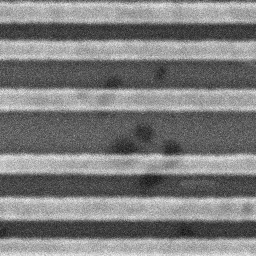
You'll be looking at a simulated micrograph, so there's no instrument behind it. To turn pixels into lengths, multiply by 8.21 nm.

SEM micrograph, lines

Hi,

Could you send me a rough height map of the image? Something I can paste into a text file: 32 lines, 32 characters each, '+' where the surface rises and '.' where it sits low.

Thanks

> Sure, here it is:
+.+++++++++++.+..+.+++.++++++++.
++++++++++++++++++++++++++++++++
++++++++++++++++++++++++++++++++
................................
................................
++++++++++++++++++++++++++++++++
++++++++++++++++++++++++++++++++
................................
................................
................................
................................
++++++++++++++++++++++++++++++++
++++++++++++++++++++++++++++++++
++++++++++++++++++++++++++++++++
................................
................................
................................
................................
................................
+++++...+.+++.+.++++...+.....+++
++++++++++++++++++++++++++++++++
++++++++++++++++++++++++++++++++
................................
................................
................................
++++++++++++++++++++++++++++++++
++++++++++++++++++++++++++++++++
................................
................................
................................
++++++++++++++++++++++++++++++++
++++++++++++++++++++++++++++++++